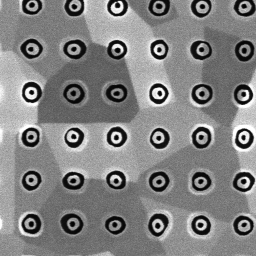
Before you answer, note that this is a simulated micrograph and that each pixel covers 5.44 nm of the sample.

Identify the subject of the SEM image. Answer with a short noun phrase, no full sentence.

a regular array of ring-shaped grooves with a dot in the middle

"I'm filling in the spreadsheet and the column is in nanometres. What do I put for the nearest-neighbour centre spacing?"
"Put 225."